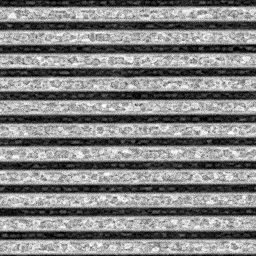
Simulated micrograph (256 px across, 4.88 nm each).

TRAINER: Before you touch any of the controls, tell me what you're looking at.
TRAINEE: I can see parallel lines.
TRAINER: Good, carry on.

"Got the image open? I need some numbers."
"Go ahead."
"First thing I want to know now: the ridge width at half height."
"69.5 nm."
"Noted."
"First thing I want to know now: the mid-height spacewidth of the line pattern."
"45.1 nanometres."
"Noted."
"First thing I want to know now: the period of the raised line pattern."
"114 nanometres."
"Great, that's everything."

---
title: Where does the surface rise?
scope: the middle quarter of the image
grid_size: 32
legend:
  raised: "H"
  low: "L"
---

HHHHHHHHHHHHHHHHHHHHHHHHHHHHHHHH
LLLLLLLLLLLLLLLLLLLLLLLLLLLLLLLL
LLLLLLLLLLLLLLLLLLLLLLLLLLLLLLLL
HHHHHHHHHHHHHHLLLHHHHHHHHHHHHHHH
HHHHHHHHHHHHHHHHHHHHHHHHHHHHHHHH
HHHHHHHHHHHHHHHHHHHHHHHHHHHHHHHH
HHHHHHHHHHHHHHHHHHHHHHHHHHHHHHHH
LLLLLLLLLLLLLLLLLLLLLLLLLLLLLLLL
LLLLLLLLLLLLLLLLLLLLLLLLLLLLLLLL
HHHHHHHHHHHHHHHHHHHHHHHHHHHHHHHH
HHHHHHHHHHHHHHHHHHHHHHHHHHHHHHHH
HHHHHHHHHHHHHHHHHHHHHHHHHHHHHHHH
HHHHHHHHHHHHHHHHHHHHHHHHHHHHLLLL
LLLLLLLLLLLLLLLLLLLLLLLLLLLLLLLL
LLLLLLLLLLLLLLLLLLLLLLLLLLLLLLLL
HHHHHHHHHHHHHHHHHHHHHHHHHHHHHHHH
HHHHHHHHHHHHHHHHHHHHHHHHHHHHHHHH
HHHHHHHHHHHHHHHHHHHHHHHHHHHHHHHH
LLLLLLLLLLLLLLLLLLLLLLLLLLLLLLLL
LLLLLLLLLLLLLLLLLLLLLLLLLLLLLLLL
LLLLLLLLLLLLLLLLLLLLLLLLLLLLLLLL
HHHHHHHHHHHHHHHHHHHHHHHHHHHHHHHH
HHHHHHHHHHHHHHHHHHHHHHHHHHHHHHHH
HHHHHHHHHHHHHHHHHHHHHHHHHHHHHHHH
LLLLLLLLLLLLLLLLLLLLLLLLLLLLLLLL
LLLLLLLLLLLLLLLLLLLLLLLLLLLLLLLL
LLLLLLLLLLLLLLLLLLLLLLLLLLLLLLLL
HHHHHHHHHHHHHHHHHHHHHHHHHHHHHHHH
HHHHHHHHHHHHHHHHHHHHHHHHHHHHHHHH
HHHHHHHHHHHHHHHHHHHHHHHHHHHHHHHH
LLLLLLLLLLLLLLLLLLLLLLLLLLLLLLLL
LLLLLLLLLLLLLLLLLLLLLLLLLLLLLLLL